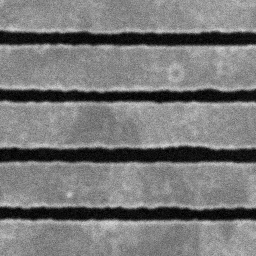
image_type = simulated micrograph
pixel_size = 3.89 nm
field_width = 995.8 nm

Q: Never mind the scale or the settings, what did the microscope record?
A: lines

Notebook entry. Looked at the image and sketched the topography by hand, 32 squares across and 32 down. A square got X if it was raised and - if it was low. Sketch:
XXXXXXXXXXXXXXXXXXXXXXXXXXXXXXXX
XXXXXXXXXXXXXXXXXXXXXXXXXXXXXXXX
XXXXXXXXXXXXXXXXXXXXXXXXXXXXXXXX
XXXXXXXXXXXXXXXXXXXXXXXXXXXXXXXX
--------------------------------
--------------------------------
XXXXXXXXXXXXXXXXXXXXXXXXXXXXXXXX
XXXXXXXXXXXXXXXXXXXXXXXXXXXXXXXX
XXXXXXXXXXXXXXXXXXXXXXXXXXXXXXXX
XXXXXXXXXXXXXXXXXXXXXXXXXXXXXXXX
XXXXXXXXXXXXXXXXXXXXXXXXXXXXXXXX
--------------------------------
--------------------------------
XXXXXXXXXXXXXXXXXXXXXXXXXXXXXXXX
XXXXXXXXXXXXXXXXXXXXXXXXXXXXXXXX
XXXXXXXXXXXXXXXXXXXXXXXXXXXXXXXX
XXXXXXXXXXXXXXXXXXXXXXXXXXXXXXXX
XXXXXXXXXXXXXXXXXXXXXXXXXXXXXXXX
-------X-----X------------XXXX--
--------------------------------
XXXXXXXXXXXXXXXXXXXXXXXXXXXXXXXX
XXXXXXXXXXXXXXXXXXXXXXXXXXXXXXXX
XXXXXXXXXXXXXXXXXXXXXXXXXXXXXXXX
XXXXXXXXXXXXXXXXXXXXXXXXXXXXXXXX
XXXXXXXXXXXXXXXXXXXXXXXXXXXXXXXX
XXXXXXXXXXXXXXXXXXXXXXXXXXXXXXXX
--------------------------------
--X-----------------------------
XXXXXXXXXXXXXXXXXXXXXXXXXXXXXXXX
XXXXXXXXXXXXXXXXXXXXXXXXXXXXXXXX
XXXXXXXXXXXXXXXXXXXXXXXXXXXXXXXX
XXXXXXXXXXXXXXXXXXXXXXXXXXXXXXXX